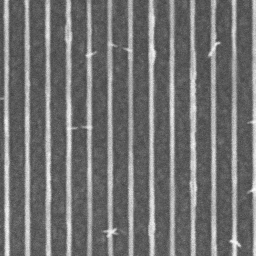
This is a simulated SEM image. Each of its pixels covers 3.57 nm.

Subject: parallel lines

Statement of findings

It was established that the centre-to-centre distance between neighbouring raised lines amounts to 73.8 nm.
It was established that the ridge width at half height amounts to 3.75 pixels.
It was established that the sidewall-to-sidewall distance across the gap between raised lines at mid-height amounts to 0.0598 micrometres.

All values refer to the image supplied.